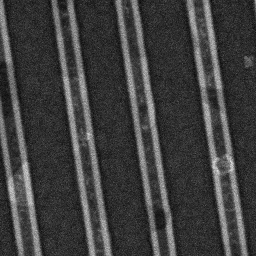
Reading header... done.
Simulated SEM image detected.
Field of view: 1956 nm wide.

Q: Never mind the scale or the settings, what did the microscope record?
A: one or a few lines or trenches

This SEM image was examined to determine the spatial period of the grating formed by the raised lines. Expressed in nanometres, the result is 518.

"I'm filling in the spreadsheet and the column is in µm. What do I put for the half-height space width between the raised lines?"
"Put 0.414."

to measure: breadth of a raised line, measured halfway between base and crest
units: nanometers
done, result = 121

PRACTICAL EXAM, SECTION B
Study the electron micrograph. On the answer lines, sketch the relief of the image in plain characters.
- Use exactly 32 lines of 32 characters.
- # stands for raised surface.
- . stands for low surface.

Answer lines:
.......##......##.......##......
.......##......##.......##......
.......##......##.......##......
#......##......##.......##......
#......##......##.......##......
#.......#.......##......###.....
#.......##......##.......##.....
#.......##......##.......##.....
#.......##......##.......##.....
#.......##......##.......##.....
##......##......##.......##.....
##.......#.......##.......##....
##.......##......##.......##....
##.......##......##.......##....
##.......##......##.......##....
##.......##......##.......##....
###......##......##.......##....
###......##......##.......##....
.##.......##......##......###...
.##.......##......##.......##...
.##.......##......##.......##...
.##.......##......##.......##...
.##.......##......##.......##...
.###......##......##.......##...
..##......##.......##......###..
..##.......##......##.......##..
..##.......##......##.......##..
..##.......##......##.......##..
..##.......##......##.......##..
..###......##......##.......##..
..###......##......##.......##..
...##.......##......##......###.